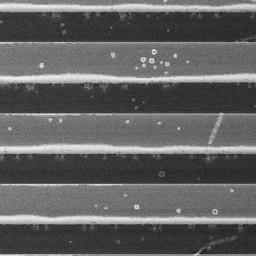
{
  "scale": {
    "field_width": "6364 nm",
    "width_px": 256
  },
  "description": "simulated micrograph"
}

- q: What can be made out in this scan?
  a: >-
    lines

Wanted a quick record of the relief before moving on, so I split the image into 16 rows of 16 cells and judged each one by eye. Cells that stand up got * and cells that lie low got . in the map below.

****************
................
................
****************
****************
................
................
****************
****************
................
................
................
****************
****************
................
................